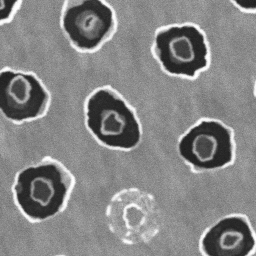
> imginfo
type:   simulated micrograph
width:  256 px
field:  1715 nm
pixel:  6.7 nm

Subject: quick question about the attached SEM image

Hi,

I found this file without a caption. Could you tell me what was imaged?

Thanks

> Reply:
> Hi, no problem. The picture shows ring-shaped grooves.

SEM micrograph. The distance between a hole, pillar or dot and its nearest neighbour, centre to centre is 657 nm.